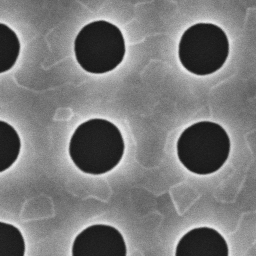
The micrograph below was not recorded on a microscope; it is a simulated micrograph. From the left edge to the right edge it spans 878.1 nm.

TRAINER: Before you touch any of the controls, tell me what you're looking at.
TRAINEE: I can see holes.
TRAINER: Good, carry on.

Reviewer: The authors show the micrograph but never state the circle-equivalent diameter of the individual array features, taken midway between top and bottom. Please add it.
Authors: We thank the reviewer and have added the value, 181 nm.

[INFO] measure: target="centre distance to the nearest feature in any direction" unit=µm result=0.34